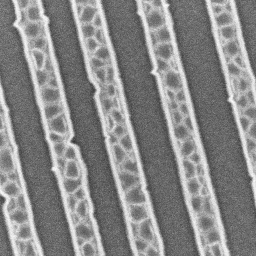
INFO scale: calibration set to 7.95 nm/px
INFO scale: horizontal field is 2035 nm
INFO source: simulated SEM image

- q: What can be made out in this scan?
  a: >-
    parallel lines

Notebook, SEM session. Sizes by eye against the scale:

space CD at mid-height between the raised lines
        0.302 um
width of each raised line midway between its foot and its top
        188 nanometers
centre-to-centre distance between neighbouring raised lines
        485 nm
